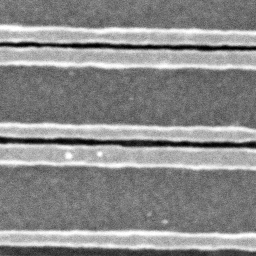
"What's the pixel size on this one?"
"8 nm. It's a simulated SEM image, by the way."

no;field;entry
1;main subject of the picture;lines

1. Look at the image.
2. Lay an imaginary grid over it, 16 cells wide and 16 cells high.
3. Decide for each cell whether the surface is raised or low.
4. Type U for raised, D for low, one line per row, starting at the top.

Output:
DDDDDDDDDDDDDDDD
DDDDDDDDDDDDDDDD
UUUUUUUUUUUUUUUU
UUUUUUUUUUUUUUUU
DDDDDDDDDDDDDDDD
DDDDDDDDDDDDDDDD
DDDDDDDDDDDDDDDD
DDDDDDDDDDDDDDDD
UUUUUUUUUUUUUUUU
UUUUUUUUUUUUUUUU
DDDDDDDDDDDDDDUU
DDDDDDDDDDDDDDDD
DDDDDDDDDDDDDDDD
DDDDDDDDDDDDDDDD
UDDDDDDDDDDDDDDD
UUUUUUUUUUUUUUUU